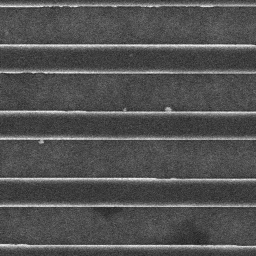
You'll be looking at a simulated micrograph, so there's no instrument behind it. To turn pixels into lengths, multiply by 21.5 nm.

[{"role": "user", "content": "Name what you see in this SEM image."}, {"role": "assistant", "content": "lines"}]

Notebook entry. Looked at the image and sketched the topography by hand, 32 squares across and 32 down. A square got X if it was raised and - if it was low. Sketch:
XXXXXXXXXXXXXXXXXXXXXXXXXXXXXXXX
--------------------------------
--------------------------------
--------------------------------
--------------------------------
--------------------------------
XXXXXXXXXXXXXXXXXXXXXXXXXXXXXXXX
XXXXXXXXXXXXXXXXXXXXXXXXXXXXXXXX
XXXXXXXXXXXXXXXXXXXXXXXXXXXXXXXX
--------------------------------
--------------------------------
--------------------------------
--------------------------------
--------------------------------
XXXXXXXXXXXXXXXXXXXXXXXXXXXXXXXX
XXXXXXXXXXXXXXXXXXXXXXXXXXXXXXXX
XXXXXXXXXXXXXXXXXXXXXXXXXXXXXXXX
--------------------------------
--------------------------------
--------------------------------
--------------------------------
--------------------------------
XXXXXXXXXXXXXXXXXXXXXXXXXXXXXXXX
XXXXXXXXXXXXXXXXXXXXXXXXXXXXXXXX
XXXXXXXXXXXXXXXXXXXXXXXXXXXXXXXX
XXXXXXXXXXXXXXXXXXXXXXXXXXXXXXXX
--------------------------------
--------------------------------
--------------------------------
--------------------------------
--------------------------------
XXXXXXXXXXXXXXXXXXXXXXXXXXXXXXXX